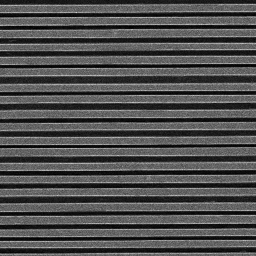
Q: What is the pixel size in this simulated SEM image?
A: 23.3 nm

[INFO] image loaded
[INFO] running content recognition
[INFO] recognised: parallel lines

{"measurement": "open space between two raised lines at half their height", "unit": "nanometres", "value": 120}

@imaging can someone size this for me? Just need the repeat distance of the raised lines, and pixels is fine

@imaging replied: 13.1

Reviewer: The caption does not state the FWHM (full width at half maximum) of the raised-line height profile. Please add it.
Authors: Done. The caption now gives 0.184 micrometres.